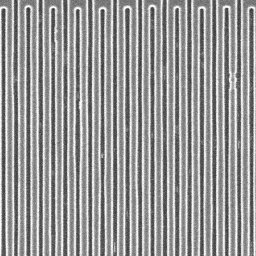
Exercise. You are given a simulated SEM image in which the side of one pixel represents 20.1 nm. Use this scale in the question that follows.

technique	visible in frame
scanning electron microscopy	parallel lines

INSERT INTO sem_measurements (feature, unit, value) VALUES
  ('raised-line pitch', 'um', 0.249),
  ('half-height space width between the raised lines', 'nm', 116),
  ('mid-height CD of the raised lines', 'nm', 136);